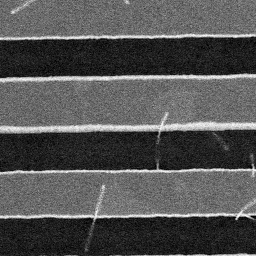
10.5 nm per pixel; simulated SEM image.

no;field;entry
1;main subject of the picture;lines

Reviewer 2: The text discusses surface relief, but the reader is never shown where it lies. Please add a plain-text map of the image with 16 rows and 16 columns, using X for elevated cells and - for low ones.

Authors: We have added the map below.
XXXXXXXXXXXXXXXX
XXXXXXXXXXXXXXXX
----------------
----------------
----------------
XXXXXXXXXXXXXXXX
XXXXXXXXXXXXXXXX
XXXXXXXXXXXXXXXX
----------------
----------------
----------------
XXXXXXXXXXXXXXXX
XXXXXXXXXXXXXXXX
XXXXXXXXXXXX--XX
----------------
----------------